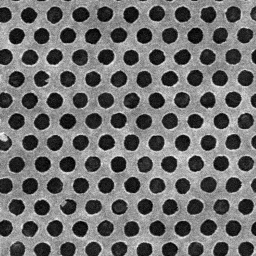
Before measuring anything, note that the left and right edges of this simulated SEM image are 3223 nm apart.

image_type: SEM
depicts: a regular array of holes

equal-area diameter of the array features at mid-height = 209 nm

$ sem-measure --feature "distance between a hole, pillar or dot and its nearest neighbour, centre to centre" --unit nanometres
308